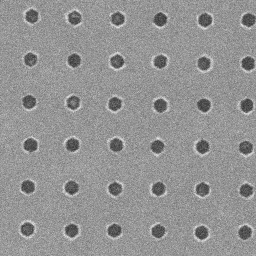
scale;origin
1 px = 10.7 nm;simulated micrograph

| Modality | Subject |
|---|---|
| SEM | a regular array of holes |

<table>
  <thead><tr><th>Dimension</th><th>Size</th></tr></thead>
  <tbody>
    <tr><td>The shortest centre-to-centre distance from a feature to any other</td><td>0.453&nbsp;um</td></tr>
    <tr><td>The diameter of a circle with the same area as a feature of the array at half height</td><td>14.6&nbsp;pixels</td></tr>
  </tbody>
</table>